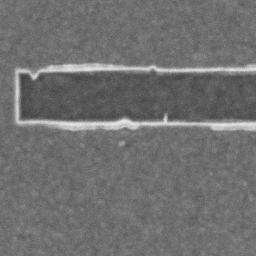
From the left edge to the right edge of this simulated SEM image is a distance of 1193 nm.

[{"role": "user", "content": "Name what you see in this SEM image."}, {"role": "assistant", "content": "one or a few lines or trenches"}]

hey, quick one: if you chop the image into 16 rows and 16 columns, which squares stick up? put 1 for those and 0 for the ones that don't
1111111111111111
1111111111111111
1111111111111111
1111111111111111
1110000000000000
1000000000000000
1000000000000000
1000000000000000
1111111111111111
1111111111111111
1111111111111111
1111111111111111
1111111111111111
1111111111111111
1111111111111111
1111111111111111